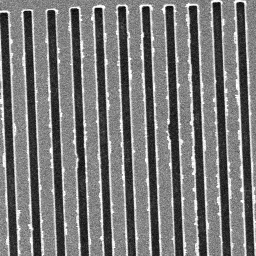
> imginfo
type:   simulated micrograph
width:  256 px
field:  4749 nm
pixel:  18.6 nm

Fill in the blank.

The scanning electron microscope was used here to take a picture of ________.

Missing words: parallel lines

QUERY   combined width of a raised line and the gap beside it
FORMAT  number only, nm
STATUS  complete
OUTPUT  439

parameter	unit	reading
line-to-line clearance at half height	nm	176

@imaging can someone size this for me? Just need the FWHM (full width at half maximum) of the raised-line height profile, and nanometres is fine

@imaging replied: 264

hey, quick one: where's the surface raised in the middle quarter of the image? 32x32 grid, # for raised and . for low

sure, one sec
##...###..####..####..####..####
##...###..####..####..####..####
##...###...###..####..####..####
##...###...###...###..####..####
##...###...###...###..####..####
##...###...###...###...###..####
##...###...###...###...###..####
##...###...###...###...###...###
##...###...###...###...###...###
##...###...###...###...###...###
##...###...###...###...###...###
##...###...###...###...###...###
##...###...###...###...###...###
##...###...###...###...###...###
###..###...###...###...###...###
###..###...###...###...###...###
###..####..###...###...###...###
###..####..###...####..###...###
###..####..####..####..###...###
###..####..####..####..###...###
###..####..####..####..###...###
###..####..####..####..####..###
###..####..####..####..####..###
###..####..####..####..####..###
###...###..####..####..####..###
###...###..####..####..####..###
###...###...###..####..####..###
###...###...###..####..####..###
###...###...###...###..####..###
###...###...###...###...###..###
###...###...###...###...###..###
###...###...###...###...###...##